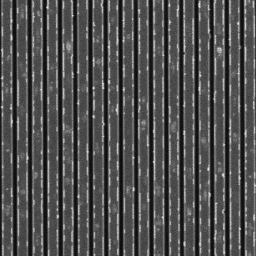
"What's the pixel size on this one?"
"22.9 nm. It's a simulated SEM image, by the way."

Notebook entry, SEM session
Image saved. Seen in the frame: parallel lines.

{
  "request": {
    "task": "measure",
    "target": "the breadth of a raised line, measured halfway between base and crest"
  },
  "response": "246 nm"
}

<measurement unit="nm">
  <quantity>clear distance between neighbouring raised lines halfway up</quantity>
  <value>109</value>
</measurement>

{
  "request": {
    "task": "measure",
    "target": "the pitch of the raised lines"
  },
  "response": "347 nm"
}